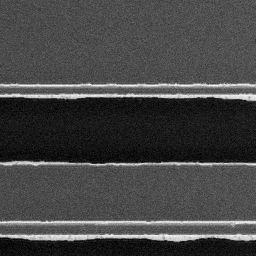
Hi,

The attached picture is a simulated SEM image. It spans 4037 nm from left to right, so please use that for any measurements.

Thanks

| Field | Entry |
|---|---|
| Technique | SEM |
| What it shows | lines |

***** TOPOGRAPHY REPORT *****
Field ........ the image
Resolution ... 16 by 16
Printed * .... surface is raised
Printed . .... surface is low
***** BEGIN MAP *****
****************
****************
****************
****************
****************
****************
................
................
................
................
****************
****************
****************
****************
****************
................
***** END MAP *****